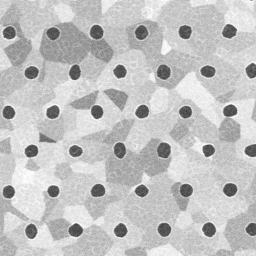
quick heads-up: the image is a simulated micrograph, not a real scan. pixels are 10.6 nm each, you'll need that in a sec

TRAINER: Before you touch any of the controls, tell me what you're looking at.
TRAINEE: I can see a regular array of holes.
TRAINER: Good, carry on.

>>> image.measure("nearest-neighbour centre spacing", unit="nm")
464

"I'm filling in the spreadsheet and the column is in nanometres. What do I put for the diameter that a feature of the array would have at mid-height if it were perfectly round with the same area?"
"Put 156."